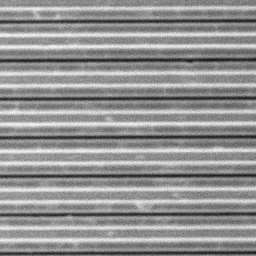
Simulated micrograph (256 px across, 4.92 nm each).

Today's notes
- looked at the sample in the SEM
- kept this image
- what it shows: parallel lines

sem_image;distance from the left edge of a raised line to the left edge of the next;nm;95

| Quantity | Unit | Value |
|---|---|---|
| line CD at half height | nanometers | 61.5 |